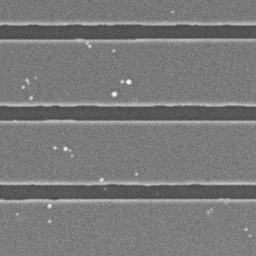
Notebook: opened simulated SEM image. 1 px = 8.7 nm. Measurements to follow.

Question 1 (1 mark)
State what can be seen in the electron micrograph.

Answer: lines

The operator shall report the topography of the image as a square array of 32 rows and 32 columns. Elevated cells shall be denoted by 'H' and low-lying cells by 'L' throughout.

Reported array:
HHHHHHHHHHHHHHHHHHHHHHHHHHHHHHHH
HHHHHHHHHHHHHHHHHHHHHHHHHHHHHHHH
HHHHHHHHHHHHHHHHHHHHHHHHHHHHHHHH
LLLLLLLLLLLLLLLLLLLLLLLLLLLLLLLL
LLLLLLLLLLLLLLLLLLLLLLLLLLLLLLLL
HHHHHHHHHHHHHHHHHHHHHHHHHHHHHHHH
HHHHHHHHHHHHHHHHHHHHHHHHHHHHHHHH
HHHHHHHHHHHHHHHHHHHHHHHHHHHHHHHH
HHHHHHHHHHHHHHHHHHHHHHHHHHHHHHHH
HHHHHHHHHHHHHHHHHHHHHHHHHHHHHHHH
HHHHHHHHHHHHHHHHHHHHHHHHHHHHHHHH
HHHHHHHHHHHHHHHHHHHHHHHHHHHHHHHH
HHHHHHHHHHHHHHHHHHHHHHHHHHHHHHHH
LLLLLLLLLLLLLLLLLLLLLLLLLLLLLLLL
LLLLLLLLLLLLLLLLLLLLLLLLLLLLLLLL
HHHHHHHHHHHHHHHHHHHHHHHHHHHHHHHH
HHHHHHHHHHHHHHHHHHHHHHHHHHHHHHHH
HHHHHHHHHHHHHHHHHHHHHHHHHHHHHHHH
HHHHHHHHHHHHHHHHHHHHHHHHHHHHHHHH
HHHHHHHHHHHHHHHHHHHHHHHHHHHHHHHH
HHHHHHHHHHHHHHHHHHHHHHHHHHHHHHHH
HHHHHHHHHHHHHHHHHHHHHHHHHHHHHHHH
HHHHHHHHHHHHHHHHHHHHHHHHHHHHHHHH
LLLLLLLLLLLLLLLLLLLLLLLLLLLLLLLL
LLLLLLLLLLLLLLLLLLLLLLLLLLLLLLLL
HHHHHHHHHHHHHHHHHHHHHHHHHHHHHHHH
HHHHHHHHHHHHHHHHHHHHHHHHHHHHHHHH
HHHHHHHHHHHHHHHHHHHHHHHHHHHHHHHH
HHHHHHHHHHHHHHHHHHHHHHHHHHHHHHHH
HHHHHHHHHHHHHHHHHHHHHHHHHHHHHHHH
HHHHHHHHHHHHHHHHHHHHHHHHHHHHHHHH
HHHHHHHHHHHHHHHHHHHHHHHHHHHHHHHH